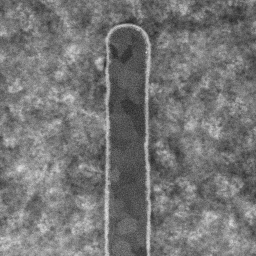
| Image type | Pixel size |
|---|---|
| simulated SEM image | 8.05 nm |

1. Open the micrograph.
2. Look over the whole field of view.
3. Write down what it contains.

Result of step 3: one or a few lines or trenches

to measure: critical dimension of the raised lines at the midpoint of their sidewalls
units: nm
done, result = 332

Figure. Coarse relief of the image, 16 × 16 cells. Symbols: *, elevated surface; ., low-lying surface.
................
................
.......**.......
.......**.......
.......**.......
.......**.......
.......**.......
.......**.......
.......**.......
.......**.......
.......**.......
.......**.......
.......**.......
.......**.......
.......**.......
.......**.......